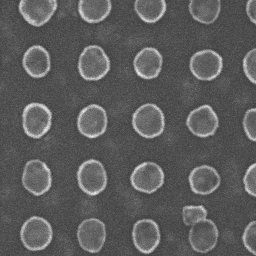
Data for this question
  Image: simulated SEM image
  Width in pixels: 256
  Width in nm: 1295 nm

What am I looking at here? a regular array of raised bodies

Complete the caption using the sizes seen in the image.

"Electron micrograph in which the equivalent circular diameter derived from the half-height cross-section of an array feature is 158 nm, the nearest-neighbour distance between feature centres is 54.7 px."